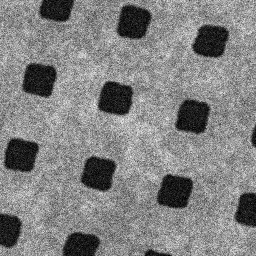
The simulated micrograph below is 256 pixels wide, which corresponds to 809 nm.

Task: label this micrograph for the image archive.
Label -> a regular array of holes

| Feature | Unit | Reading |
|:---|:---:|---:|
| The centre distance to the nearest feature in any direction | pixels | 77.2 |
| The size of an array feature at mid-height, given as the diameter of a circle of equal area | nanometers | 115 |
